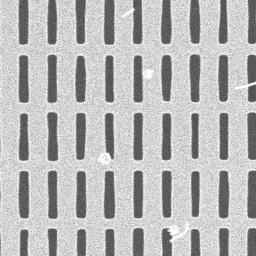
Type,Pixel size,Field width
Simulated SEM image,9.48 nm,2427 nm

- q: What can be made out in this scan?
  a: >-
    groups of lines, slits or small figures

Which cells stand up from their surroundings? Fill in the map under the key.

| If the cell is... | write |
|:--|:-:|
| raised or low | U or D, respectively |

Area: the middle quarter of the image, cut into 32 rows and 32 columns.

UUUDDUUUUUDDUUUUUDDDUUUUDDDUUUUD
UUUDDDUUUUDDUUUUUDDDUUUUDDDUUUUD
UUUDDDUUUUDDUUUUUDDDUUUUDDDUUUUD
UUUDDDUUUUDDUUUUUDDDUUUUDDDUUUUD
UUUDDDUUUUDDUUUUUDDDUUUUDDDUUUUD
UUUDDDUUUUDDUUUUUDDDUUUUDDDUUUUD
UUUDDDUUUUDDUUUUUDDDUUUUDDDUUUUD
UUUDDDUUUUDDDUUUUDDDUUUUDDDUUUUD
UUUDDUUUUUDDDUUUUDDDUUUUDDDUUUUU
UUUDDUUUUUUDUUUUUUDUUUUUUUUUUUUU
UUUUUUUUUUUUUUUUUUUUUUUUUUUUUUUU
UUUUUUUUUUUUUUUUUUUUUUUUUUUUUUUU
UUUDDUUUUUDDUUUUUUDDUUUUUDDUUUUU
UUUDDDUUUUDDUUUUUDDDUUUUDDDUUUUU
UUUDDDUUUUDDUUUUUDDDUUUUDDDUUUUU
UUUDDDUUUUDDUUUUUDDDUUUUDDDUUUUU
UUUDDDUUUUDDUUUUUDDDUUUUDDDUUUUU
UUUDDDUUUUDDUUUUUDDDUUUUDDDUUUUU
UUUDDDUUUUDDDUUUUDDDUUUUDDDUUUUU
UUUDDDUUUUDDDUUUUDDDUUUUDDDUUUUU
UUUDDUUUUUDDDUUUUDDDUUUUDDDUUUUU
UUUDDUUUUUDDDUUUUDDDUUUUDDDUUUUU
UUUDDUUUUUUDDUUUUDDDUUUUDDDUUUUU
UUUDDUUUUUUUUUUUUDDDUUUUDDDUUUUU
UUUUUUUUUUUUUUUUUUUUUUUUUUUUUUUU
UUUUUUUUUUUUUUUUUUUUUUUUUUUUUUUU
UUUUUUUUUUUUUUUUUUUUUUUUUUUUUUUU
UUUDDDUUUUDDDUUUUDDDUUUUDDDUUUUU
UUUDDDUUUUDDDUUUUDDDUUUUDDDUUUUU
UUUDDDUUUUDDDUUUUDDDUUUUDDDUUUUU
UUUDDDUUUUDDDUUUUDDDUUUUDDDUUUUU
UUUDDDUUUUDDDUUUUDDDUUUUDDDUUUUU